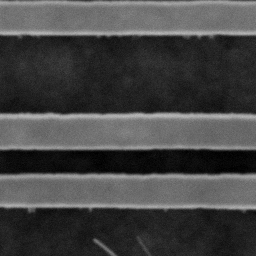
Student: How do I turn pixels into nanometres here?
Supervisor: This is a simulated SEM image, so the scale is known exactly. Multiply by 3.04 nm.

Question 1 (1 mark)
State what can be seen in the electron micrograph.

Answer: lines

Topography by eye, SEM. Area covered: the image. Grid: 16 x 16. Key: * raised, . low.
****************
****************
................
................
................
................
................
****************
****************
................
................
****************
****************
................
................
................